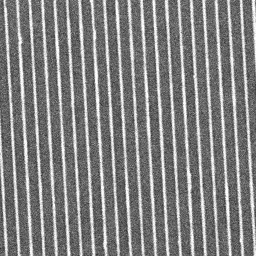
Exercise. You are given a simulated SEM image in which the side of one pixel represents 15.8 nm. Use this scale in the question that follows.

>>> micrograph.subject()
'parallel lines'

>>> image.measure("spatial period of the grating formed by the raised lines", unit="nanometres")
195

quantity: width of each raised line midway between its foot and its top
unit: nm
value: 39.3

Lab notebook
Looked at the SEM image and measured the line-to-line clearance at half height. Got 159 nm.